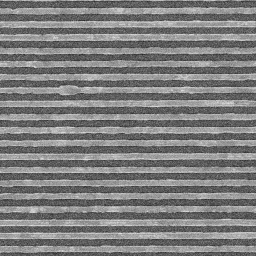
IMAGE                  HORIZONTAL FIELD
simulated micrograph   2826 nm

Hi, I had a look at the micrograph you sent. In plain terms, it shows parallel lines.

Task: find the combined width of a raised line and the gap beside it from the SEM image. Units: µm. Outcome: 0.146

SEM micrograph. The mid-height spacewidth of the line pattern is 82.8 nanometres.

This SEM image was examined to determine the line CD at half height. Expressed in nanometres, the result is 62.1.